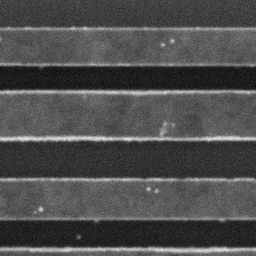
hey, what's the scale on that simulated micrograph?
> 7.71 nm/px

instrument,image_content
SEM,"lines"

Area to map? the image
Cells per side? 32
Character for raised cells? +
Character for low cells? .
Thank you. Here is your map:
................................
................................
................................
.+.+.+...++.+.....+.....+.......
++++++++++++++++++++++++++++++++
++++++++++++++++++++++++++++++++
++++++++++++++++++++++++++++++++
++++++++++++++++++++++++++++++++
................................
................................
................................
++++++++++++++++++++++++++++++++
++++++++++++++++++++++++++++++++
++++++++++++++++++++++++++++++++
++++++++++++++++++++++++++++++++
++++++++++++++++++++++++++++++++
++++++++++++++++++++++++++++++++
................................
................................
................................
................................
................................
++++++++++++++++++++++++++++++++
++++++++++++++++++++++++++++++++
++++++++++++++++++++++++++++++++
++++++++++++++++++++++++++++++++
++++++++++++++++++++++++++++++++
.......................+........
................................
................................
................................
++++++++++++++++++++++++++++++++